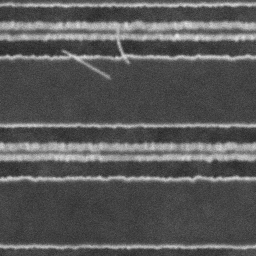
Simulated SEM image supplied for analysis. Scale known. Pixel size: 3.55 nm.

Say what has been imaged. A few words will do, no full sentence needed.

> lines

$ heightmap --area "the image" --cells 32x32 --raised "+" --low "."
++++++++++++++++++++++++++++++++
................................
................................
++++++++++++++++++++++++++++++++
++++++++++++++++++++++++++++++++
................................
................................
++++++++++++++++++++++++++++++++
++++++++++++++++++++++++++++++++
++++++++++++++++++++++++++++++++
++++++++++++++++++++++++++++++++
++++++++++++++++++++++++++++++++
++++++++++++++++++++++++++++++++
++++++++++++++++++++++++++++++++
++++++++++++++++++++++++++++++++
++++++++++++++++++++++++++++++++
................................
................................
++++++++++++++++++++++++++++++++
++++++++++++++++++++++++++++++++
................................
................................
++++++++++++++++++++++++++++++++
++++++++++++++++++++++++++++++++
++++++++++++++++++++++++++++++++
++++++++++++++++++++++++++++++++
++++++++++++++++++++++++++++++++
++++++++++++++++++++++++++++++++
++++++++++++++++++++++++++++++++
++++++++++++++++++++++++++++++++
++++++++++++++++++++++++++++++++
................................